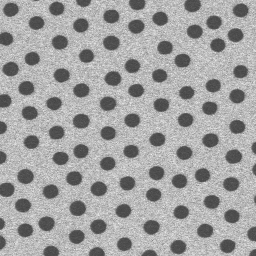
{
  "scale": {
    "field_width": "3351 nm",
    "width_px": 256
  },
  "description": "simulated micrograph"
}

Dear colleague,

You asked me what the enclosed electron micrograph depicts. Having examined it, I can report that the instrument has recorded a regular array of holes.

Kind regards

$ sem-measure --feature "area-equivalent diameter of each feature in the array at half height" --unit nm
188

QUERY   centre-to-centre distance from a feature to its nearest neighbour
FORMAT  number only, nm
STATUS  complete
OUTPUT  331